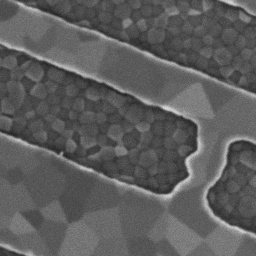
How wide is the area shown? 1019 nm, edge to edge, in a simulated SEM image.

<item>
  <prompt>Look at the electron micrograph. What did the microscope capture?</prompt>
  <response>one or a few lines or trenches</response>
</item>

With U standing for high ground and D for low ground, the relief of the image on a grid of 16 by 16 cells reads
UUDDDDDDDDDDDDDU
UUUUDDDDDDDDDDDD
UUUUUUUDDDDDDDDD
DDUUUUUUUUDDDDDD
DDDDDUUUUUUUDDDD
DDDDDDDUUUUUUUUD
DDDDDDDDDUUUUUUU
DDDDDDDDDDDDUUUU
UDDDDDDDDDDDUUUU
UUUDDDDDDDDDUUDD
UUUUUDDDDDDDUUDD
UUUUUUUUDDDUUDDD
UUUUUUUUUUUUUDDD
UUUUUUUUUUUUUDDD
UUUUUUUUUUUUUUUD
DUUUUUUUUUUUUUUU